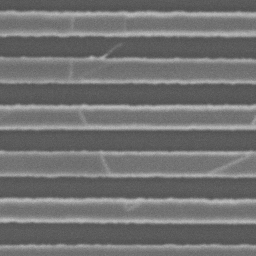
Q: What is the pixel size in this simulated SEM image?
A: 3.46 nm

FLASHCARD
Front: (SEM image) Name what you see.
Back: lines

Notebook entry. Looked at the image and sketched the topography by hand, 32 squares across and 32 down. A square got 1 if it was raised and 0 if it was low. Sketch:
00000000000000000000000000000000
01001000000000000000000000000000
11111111111111111111111111111111
11111111111111111111111111111111
00000000000000000000000000000000
00000000000000000000000000000000
00000000000000000000000000000000
11111111111111111111111111111111
11111111111111111111111111111111
11111111111111111111111111111111
00000000000000000000000000000000
00000000000000000000000000000000
00000000000000000000000000000000
11111111111111111111111111111111
11111111111111111111111111111111
11111111111111111111111111111111
00000000000000000000000000000000
00000000000000000000000000000000
00000000000000000000000000000000
11111111111111111111111111111111
11111111111111111111111111111111
11111111111111111111111111111111
00000000000000000000000000000000
00000000000000000000000000000000
00000000000000000000000000000000
11111111111111111111111111111111
11111111111111111111111111111111
11111111111111111111111111111111
00000000000000000000000000000000
00000000000000000000000000000000
00000000000000000000000000000000
11111111111111111111111111111111